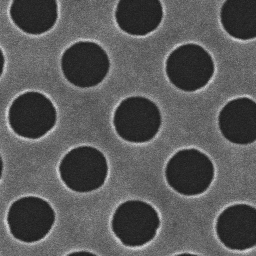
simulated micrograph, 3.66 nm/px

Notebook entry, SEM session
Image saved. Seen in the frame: a regular array of holes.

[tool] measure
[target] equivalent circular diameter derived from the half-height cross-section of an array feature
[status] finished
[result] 172 nm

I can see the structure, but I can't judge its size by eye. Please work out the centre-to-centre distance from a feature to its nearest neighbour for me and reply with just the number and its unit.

0.27 um